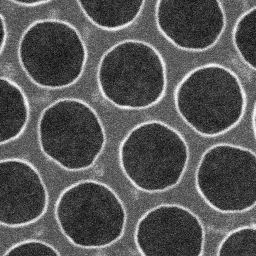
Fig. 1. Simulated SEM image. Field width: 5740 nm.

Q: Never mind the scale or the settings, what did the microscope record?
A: holes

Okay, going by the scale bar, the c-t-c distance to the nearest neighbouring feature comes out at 1850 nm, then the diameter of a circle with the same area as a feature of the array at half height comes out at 1.48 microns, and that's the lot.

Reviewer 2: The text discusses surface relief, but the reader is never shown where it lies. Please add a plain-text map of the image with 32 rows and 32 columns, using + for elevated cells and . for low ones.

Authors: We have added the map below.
++++++++++........++.......+++++
+++++++++++......+++........+++.
+++++++++++......+++........++..
++++.....+++++++++++........++..
.++.......+++++++++++......++...
+++.......+++++...++++....+++...
+++........+++.....+++++++++++..
+++.......+++.......+++++++++++.
+++.......+++.......+++++...++++
++++......++........++++.....+++
.++++....++++.......+++.......++
...++++++++++.......++........++
...+++++++++++......++........++
...+++.....+++++++++++........++
...++.......+++++++++++.......++
...++.......++++++..++++.....+++
..+++........++++.....+++...++++
.++++........+++.......+++++++++
+++++........++........++++...++
++++++......+++........+++......
...+++++...++++........++.......
....++++++++++++.......++.......
.....+++++++++++......+++.......
......+++....+++++...++++.......
......++......++++++++++++......
......+........+++++++++++......
.....++........++++.....++++++++
....+++.........++.......+++++++
++++++++.......++........+++++++
++++++++.......++........++++...
+++..+++++...++++........+++....
+......+++++++++++.......++.....